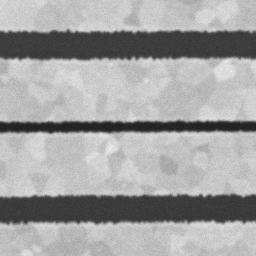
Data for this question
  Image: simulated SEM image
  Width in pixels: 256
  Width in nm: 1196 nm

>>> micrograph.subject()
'lines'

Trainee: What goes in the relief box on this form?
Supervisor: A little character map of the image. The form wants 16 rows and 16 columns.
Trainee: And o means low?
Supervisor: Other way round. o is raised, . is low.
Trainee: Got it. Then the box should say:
oooooooooooooooo
oooooooooooooooo
................
................
oooooooooooooooo
oooooooooooooooo
oooooooooooooooo
oooooooooooooooo
oooooooooooooooo
oooooooooooooooo
oooooooooooooooo
oooooooooooooooo
................
................
oooooooooooooooo
oooooooooooooooo